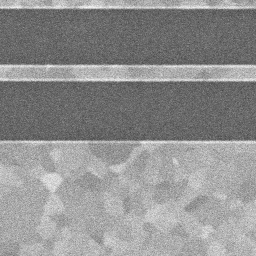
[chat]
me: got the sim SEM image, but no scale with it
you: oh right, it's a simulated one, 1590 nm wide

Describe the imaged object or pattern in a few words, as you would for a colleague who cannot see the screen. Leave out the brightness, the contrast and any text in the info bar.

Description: one or a few lines or trenches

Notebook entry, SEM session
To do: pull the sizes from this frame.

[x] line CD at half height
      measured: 92.4 nanometres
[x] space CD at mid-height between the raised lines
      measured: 372 nm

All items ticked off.